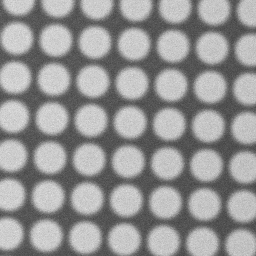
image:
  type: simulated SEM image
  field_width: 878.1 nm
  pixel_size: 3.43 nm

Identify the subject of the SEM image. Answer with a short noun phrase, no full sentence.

an array of small figures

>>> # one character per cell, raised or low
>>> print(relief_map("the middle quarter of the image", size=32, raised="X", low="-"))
--------------------------------
-----XXXXX-----XXXX-------------
X---XXXXXXX---XXXXXX----XXXXX---
X---XXXXXXX---XXXXXXX--XXXXXXX--
X---XXXXXXX--XXXXXXXX--XXXXXXXX-
X---XXXXXXX--XXXXXXXX--XXXXXXXX-
----XXXXXX----XXXXXX---XXXXXXXX-
-----XXXX-----XXXXXX----XXXXXX--
----------------XX-------XXXX---
--------------------------------
------XX------------------------
----XXXXX-----XXXXX------XX-----
X--XXXXXXX----XXXXXX----XXXXX---
X--XXXXXXX---XXXXXXX---XXXXXXX--
X--XXXXXXX---XXXXXXX---XXXXXXX--
---XXXXXXX---XXXXXXX---XXXXXXX--
----XXXXXX---XXXXXXX---XXXXXXX--
-----XXX------XXXXX----XXXXXX---
-------------------------XXX----
--------------------------------
-----XXX------------------------
---XXXXXX-----XXXX------XXX-----
---XXXXXXX---XXXXXX----XXXXXX---
---XXXXXXX--XXXXXXXX--XXXXXXX---
---XXXXXXX--XXXXXXXX--XXXXXXXX--
---XXXXXXX--XXXXXXXX--XXXXXXXX--
----XXXXX----XXXXXX---XXXXXXX---
-----XX-------XXXX-----XXXXX----
-------------------------XX-----
--------------------------------
----XXXX-------X----------------
---XXXXXX----XXXXX-----XXXXX----